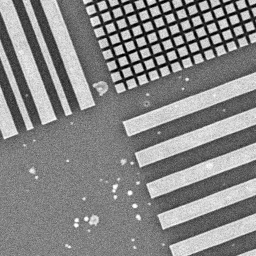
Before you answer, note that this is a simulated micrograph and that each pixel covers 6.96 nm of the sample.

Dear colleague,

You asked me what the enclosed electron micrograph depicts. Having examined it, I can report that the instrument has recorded groups of lines, slits or small figures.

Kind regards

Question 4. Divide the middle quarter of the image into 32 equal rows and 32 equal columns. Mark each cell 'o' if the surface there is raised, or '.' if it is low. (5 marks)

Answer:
oooo.......oo.....oo.o.....oo.oo
.ooo.......o...oo.oo....oo.oo...
.oooo.......oo.oo....oo.oo......
.oooo.......oo....ooooo.........
..oooo..........oo.oo...........
..oooo...o...oo.oo..............
...ooo.......oo.................
...oooo.........................
...oooo........................o
o...oooo....................oooo
o...ooo...................oooooo
oo.....................ooooooooo
o....................oooooooooo.
..................oooooooooo....
...............oooooooooo.......
...............oooooooo.........
................oooo............
................oo............oo
............................oooo
.........................ooooooo
......................oooooooooo
....................oooooooooo..
..................oooooooooo....
..................ooooooo.......
...................ooo..........
...................o............
..............................oo
...........................ooooo
.........................ooooooo
......................oooooooooo
.....................ooooooooo..
.....................ooooooo....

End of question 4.